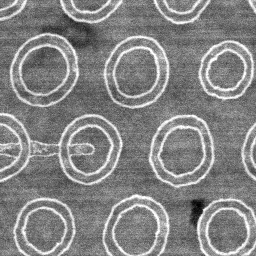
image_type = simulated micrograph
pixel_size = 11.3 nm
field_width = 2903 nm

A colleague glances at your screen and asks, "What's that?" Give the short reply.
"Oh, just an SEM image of ring-shaped raised bodies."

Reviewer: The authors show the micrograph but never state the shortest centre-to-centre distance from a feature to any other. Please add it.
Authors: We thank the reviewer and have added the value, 1020 nanometres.